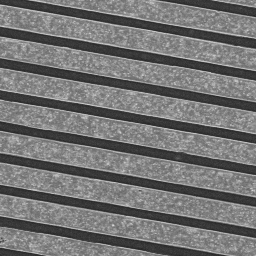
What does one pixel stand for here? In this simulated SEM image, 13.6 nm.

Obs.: parallel lines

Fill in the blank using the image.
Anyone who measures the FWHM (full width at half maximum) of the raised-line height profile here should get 280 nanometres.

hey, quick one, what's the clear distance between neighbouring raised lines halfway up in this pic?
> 141 nm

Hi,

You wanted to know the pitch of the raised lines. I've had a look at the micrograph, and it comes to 423 nm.